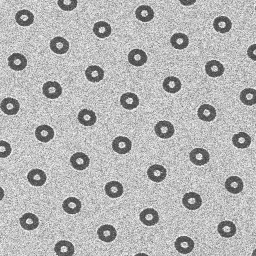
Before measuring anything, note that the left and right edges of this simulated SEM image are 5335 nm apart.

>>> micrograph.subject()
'a regular array of ring-shaped grooves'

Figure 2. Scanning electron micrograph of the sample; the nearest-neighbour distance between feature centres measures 44.4 pixels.